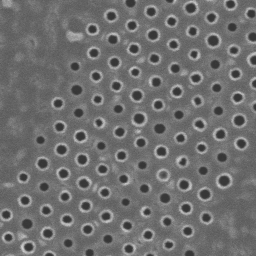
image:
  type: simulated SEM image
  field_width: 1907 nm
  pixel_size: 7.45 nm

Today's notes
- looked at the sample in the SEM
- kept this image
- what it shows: a regular array of holes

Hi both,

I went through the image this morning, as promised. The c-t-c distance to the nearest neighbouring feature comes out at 169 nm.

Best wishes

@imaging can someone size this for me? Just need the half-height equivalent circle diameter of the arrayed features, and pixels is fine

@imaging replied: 8.52